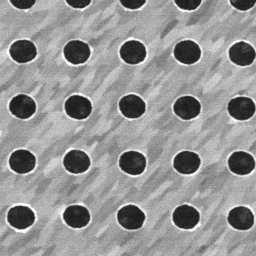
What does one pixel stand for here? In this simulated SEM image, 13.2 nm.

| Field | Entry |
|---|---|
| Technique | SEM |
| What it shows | a regular array of holes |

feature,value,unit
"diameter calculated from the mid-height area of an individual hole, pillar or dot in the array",354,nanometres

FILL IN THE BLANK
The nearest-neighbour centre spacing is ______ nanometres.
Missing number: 713